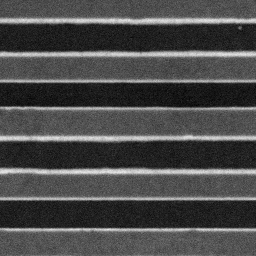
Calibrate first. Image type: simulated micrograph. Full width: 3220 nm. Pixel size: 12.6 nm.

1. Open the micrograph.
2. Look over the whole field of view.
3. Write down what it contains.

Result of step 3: lines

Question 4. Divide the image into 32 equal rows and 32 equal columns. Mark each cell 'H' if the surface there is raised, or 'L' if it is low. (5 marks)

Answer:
HHHHHHHHHHHHHHHHHHHHHHHHHHHHHHHH
HHHHHHHHHHHHHHHHHHHHHHHHHHHHHHHH
HHHHHHHHHHHHHHHHHHHHHHHHHHHHHHHH
LLLLLLLLLLLLLLLLLLLLLLLLLLLLLLLL
LLLLLLLLLLLLLLLLLLLLLLLLLLLLLLLL
LLLLLLLLLLLLLLLLLLLLLLLLLLLLLLLL
LLLLLLLLLLLLLLLLLLLLLLLLLLLLLLLL
HHHHHHHHHHHHHHHHHHHHHHHHHHHHHHHH
HHHHHHHHHHHHHHHHHHHHHHHHHHHHHHHH
HHHHHHHHHHHHHHHHHHHHHHHHHHHHHHHH
LLLLLLLLLLLLLLLLLLLLLLLLLLLLLLLL
LLLLLLLLLLLLLLLLLLLLLLLLLLLLLLLL
LLLLLLLLLLLLLLLLLLLLLLLLLLLLLLLL
HHHHHHHHLLHHHLLLLLLLLLLLLLLLLLLL
HHHHHHHHHHHHHHHHHHHHHHHHHHHHHHHH
HHHHHHHHHHHHHHHHHHHHHHHHHHHHHHHH
HHHHHHHHHHHHHHHHHHHHHHHHHHHHHHHH
LLLLLLLLLLLLLLLLLLLLLLLLLLLLLLLL
LLLLLLLLLLLLLLLLLLLLLLLLLLLLLLLL
LLLLLLLLLLLLLLLLLLLLLLLLLLLLLLLL
LLLLLLLLLLLLLLLLLLLLLLLLLLLLLLLL
LLLLLLLLLLLLLLLLLLLLLLLLLLLLLLLL
HHHHHHHHHHHHHHHHHHHHHHHHHHHHHHHH
HHHHHHHHHHHHHHHHHHHHHHHHHHHHHHHH
HHHHHHHHHHHHHHHHHHHHHHHHHHHHHHHH
LLLLLLLLLLLLLLLLLLLLLLLLLLLLLLLL
LLLLLLLLLLLLLLLLLLLLLLLLLLLLLLLL
LLLLLLLLLLLLLLLLLLLLLLLLLLLLLLLL
LLLLLLLLLLLLLLLLLLLLLLLLLLLLLLLL
HHHHHHHHHHHHHHHHHHHHHHHHHHHHHHHH
HHHHHHHHHHHHHHHHHHHHHHHHHHHHHHHH
HHHHHHHHHHHHHHHHHHHHHHHHHHHHHHHH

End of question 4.